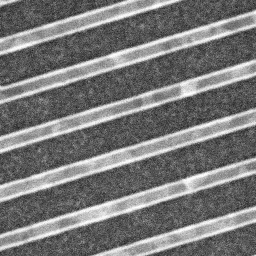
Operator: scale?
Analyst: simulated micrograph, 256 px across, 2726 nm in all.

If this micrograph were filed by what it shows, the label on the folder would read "parallel lines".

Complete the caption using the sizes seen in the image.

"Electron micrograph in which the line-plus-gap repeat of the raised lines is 0.499 µm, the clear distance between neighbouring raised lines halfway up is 372 nm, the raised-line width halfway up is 127 nanometers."